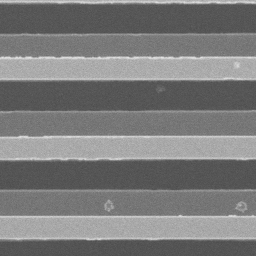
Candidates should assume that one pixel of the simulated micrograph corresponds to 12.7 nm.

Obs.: lines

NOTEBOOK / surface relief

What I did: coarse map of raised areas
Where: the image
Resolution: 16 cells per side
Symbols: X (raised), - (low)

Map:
----------------
----------------
XXXXXXXXXXXXXXXX
XXXXXXXXXXXXXXXX
XXXXXXXXXXXXXXXX
----------------
----------------
XXXXXXXXXXXXXXXX
XXXXXXXXXXXXXXXX
XXXXXXXXXXXXXXXX
----------------
----------------
XXXXXXXXXXXXXXXX
XXXXXXXXXXXXXXXX
XXXXXXXXXXXXXXXX
----------------